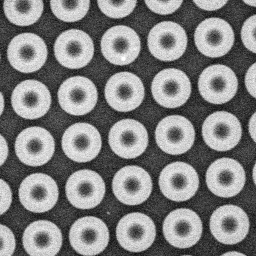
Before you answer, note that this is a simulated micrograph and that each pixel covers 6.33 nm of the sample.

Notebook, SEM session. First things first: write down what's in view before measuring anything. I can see an array of small figures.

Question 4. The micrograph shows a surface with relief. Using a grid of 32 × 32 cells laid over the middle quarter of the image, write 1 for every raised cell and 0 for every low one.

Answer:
11111000000000000000000000000000
00000000000000000000000001111000
00000000000001111000000111111100
01111000000011111110000111111110
11111110000111111110001111111110
11111111001111111111001111111111
11111111001111111111001111111111
11111111001111111111001111111110
11111111001111111111000111111110
11111111000111111110000111111100
11111111000011111110000001111000
11111110000001111000000000000000
00111000000000000000000000000000
00000000000000000000000001111100
00000000000001111100000011111110
00111110000011111111000111111111
01111111000011111111000111111111
11111111100111111111100111111111
11111111100111111111100111111111
11111111100111111111100111111111
11111111100011111111100011111111
11111111100011111111000001111110
11111111000001111110000000111000
01111110000000011000000000000000
00010000000000000000000000000000
00000000000000000100000000111111
00000100000000111111000001111111
00111111000001111111100011111111
01111111100011111111110011111111
01111111110011111111110011111111
11111111110011111111110011111111
11111111110011111111110011111111